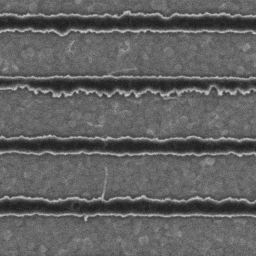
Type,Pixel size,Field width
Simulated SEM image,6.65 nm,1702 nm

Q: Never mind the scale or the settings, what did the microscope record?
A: one or a few lines or trenches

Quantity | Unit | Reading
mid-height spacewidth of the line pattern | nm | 301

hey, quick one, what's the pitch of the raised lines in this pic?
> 408 nm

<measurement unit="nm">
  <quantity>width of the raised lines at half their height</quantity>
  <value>112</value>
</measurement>